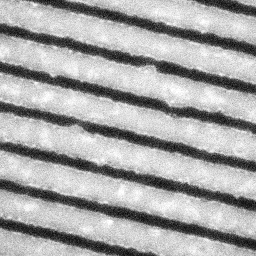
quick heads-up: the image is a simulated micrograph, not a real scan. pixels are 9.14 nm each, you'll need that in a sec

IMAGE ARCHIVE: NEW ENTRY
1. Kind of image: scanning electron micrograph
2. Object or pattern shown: parallel lines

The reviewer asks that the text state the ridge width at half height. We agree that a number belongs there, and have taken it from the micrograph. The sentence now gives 122 nanometres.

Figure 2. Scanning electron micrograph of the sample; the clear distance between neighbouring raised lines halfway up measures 222 nm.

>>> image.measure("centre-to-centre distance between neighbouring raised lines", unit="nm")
346